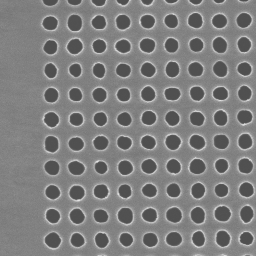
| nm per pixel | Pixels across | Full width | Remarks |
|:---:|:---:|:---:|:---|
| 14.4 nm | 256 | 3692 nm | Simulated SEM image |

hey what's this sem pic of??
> a regular array of holes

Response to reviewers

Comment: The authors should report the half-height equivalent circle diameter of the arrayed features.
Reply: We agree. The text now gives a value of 0.198 µm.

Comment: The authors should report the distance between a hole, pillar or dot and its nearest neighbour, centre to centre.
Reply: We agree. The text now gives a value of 342 nm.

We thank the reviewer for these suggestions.